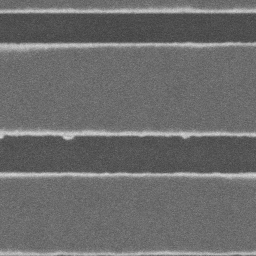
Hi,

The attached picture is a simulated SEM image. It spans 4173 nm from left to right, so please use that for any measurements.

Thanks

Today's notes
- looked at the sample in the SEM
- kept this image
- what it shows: lines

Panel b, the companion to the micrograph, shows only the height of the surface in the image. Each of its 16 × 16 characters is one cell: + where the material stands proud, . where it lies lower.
++++++++++++++++
................
................
++++++++++++++++
++++++++++++++++
++++++++++++++++
++++++++++++++++
++++++++++++++++
..............++
................
................
++++++++++++++++
++++++++++++++++
++++++++++++++++
++++++++++++++++
++++++++++++++++